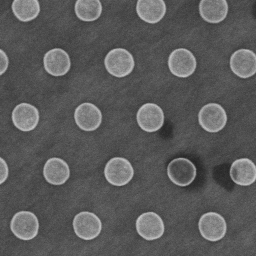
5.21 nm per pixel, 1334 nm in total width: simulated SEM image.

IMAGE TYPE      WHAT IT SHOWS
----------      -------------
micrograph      a regular array of raised bodies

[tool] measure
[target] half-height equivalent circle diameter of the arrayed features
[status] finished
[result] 0.147 microns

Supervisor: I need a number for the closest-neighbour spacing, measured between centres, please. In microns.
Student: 0.324